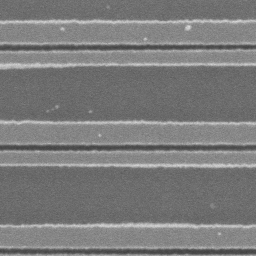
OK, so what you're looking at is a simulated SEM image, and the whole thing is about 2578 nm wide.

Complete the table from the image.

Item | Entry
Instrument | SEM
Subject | lines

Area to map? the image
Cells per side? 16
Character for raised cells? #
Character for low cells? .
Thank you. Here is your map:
................
################
################
################
................
................
................
................
################
################
................
................
................
................
################
################